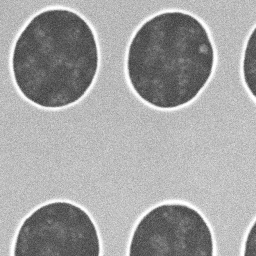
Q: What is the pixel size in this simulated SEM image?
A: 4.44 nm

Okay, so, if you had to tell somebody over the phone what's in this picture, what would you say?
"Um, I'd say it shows holes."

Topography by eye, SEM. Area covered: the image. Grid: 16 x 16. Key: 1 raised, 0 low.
1111111111111111
1100011110000111
1000001100000111
1000001100000110
1000001100000110
1000001100000110
1100111110001111
1111111111111111
1111111111111111
1111111111111111
1111111111111111
1111111111111111
1111111111111111
1100011110000111
1000001100000111
1000001100000110